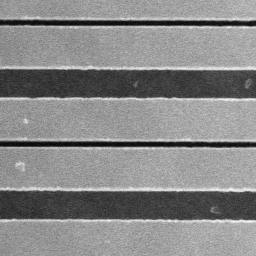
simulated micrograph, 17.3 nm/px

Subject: lines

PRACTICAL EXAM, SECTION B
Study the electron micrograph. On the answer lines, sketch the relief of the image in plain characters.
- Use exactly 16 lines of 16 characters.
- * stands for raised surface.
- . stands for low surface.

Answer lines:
****************
****************
****************
****************
................
................
****************
****************
****************
****************
****************
****************
................
................
****************
****************